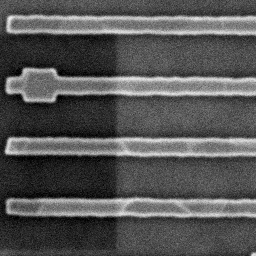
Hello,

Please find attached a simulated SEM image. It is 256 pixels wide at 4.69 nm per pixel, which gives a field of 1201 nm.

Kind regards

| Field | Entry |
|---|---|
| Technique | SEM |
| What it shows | wiring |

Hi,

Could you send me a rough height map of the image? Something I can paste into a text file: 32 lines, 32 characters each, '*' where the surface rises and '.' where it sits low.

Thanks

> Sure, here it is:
................................
................................
.*******************************
.*******************************
................................
................................
................................
................................
................................
..*****.........................
.*******************************
.*******************************
...****.........................
................................
................................
................................
................................
.******************************.
.*******************************
................................
................................
................................
................................
................................
................................
.*******************************
.*******************************
................................
................................
................................
................................
................................